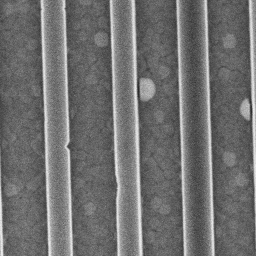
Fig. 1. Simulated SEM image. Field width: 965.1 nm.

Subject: one or a few lines or trenches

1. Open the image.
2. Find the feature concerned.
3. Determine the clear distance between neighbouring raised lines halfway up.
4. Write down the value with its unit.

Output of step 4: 0.165 um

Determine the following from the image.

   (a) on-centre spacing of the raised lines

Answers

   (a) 261 nanometers